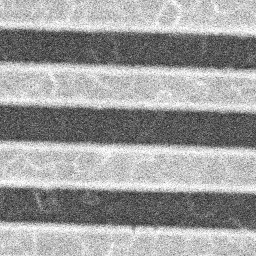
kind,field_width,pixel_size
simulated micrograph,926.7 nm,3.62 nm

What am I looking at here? one or a few lines or trenches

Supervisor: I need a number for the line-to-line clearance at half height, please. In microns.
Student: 0.166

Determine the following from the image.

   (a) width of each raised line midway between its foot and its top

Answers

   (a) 33.3 pixels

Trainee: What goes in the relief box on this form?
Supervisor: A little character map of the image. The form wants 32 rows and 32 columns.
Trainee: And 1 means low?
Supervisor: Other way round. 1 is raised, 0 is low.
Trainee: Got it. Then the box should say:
11111111111111111111111111111111
11111111111111111111111111111111
11111111111111111111111111111111
00000000000000000000111111111111
00000000000000000000000000000000
00000000000000000000000000000000
00000000000000000000000000000000
00000000000000000000000000000000
00000000000000000000000000000000
11111111111111111111111111111111
11111111111111111111111111111111
11111111111111111111111111111111
00000011111111111111111111111111
00000000000000000000000000000000
00000000000000000000000000000000
00000000000000000000000000000000
00000000000000000000000000000000
00000000000000000000000000000000
11110000000000000000000000000000
11111111111111111111111111111111
11111111111111111111111111111111
11111111111111111111111111111111
11111111111111111111111111111111
00000000000000000000000000000111
00000000000000000000000000000000
00000000000000000000000000000000
00000000000000000000000000000000
00000000000000000000000000000000
00000000000000000000000000000000
11111111111111111111111111111111
11111111111111111111111111111111
11111111111111111111111111111111